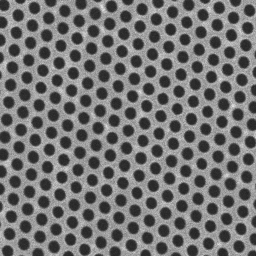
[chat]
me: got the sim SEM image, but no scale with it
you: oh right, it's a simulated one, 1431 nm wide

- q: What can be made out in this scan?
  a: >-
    a regular array of holes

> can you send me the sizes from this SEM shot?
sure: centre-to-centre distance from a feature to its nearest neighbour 97.1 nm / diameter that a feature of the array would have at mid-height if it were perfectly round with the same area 0.0671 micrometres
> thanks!